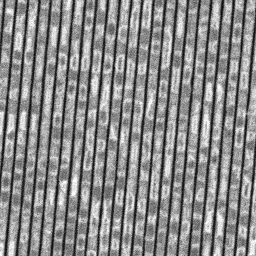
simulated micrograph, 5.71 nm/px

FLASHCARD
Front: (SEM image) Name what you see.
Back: parallel lines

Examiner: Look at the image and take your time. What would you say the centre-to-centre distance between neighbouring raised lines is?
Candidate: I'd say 0.0652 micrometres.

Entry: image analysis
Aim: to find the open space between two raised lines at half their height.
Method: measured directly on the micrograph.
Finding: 15.6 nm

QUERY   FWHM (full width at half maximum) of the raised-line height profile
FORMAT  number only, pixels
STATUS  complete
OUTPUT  8.97